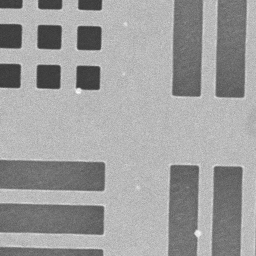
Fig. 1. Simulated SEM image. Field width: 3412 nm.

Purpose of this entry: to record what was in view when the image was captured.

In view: groups of lines, slits or small figures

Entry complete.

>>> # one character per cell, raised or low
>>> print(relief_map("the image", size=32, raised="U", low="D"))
DDDUUDDDUUDDDUUUUUUUUUDDDUUDDDDU
UUUUUUUUUUUUUUUUUUUUUUDDDUUDDDDU
UUUUUUUUUUUUUUUUUUUUUUDDDUUDDDDU
DDDUUDDDUUDDUUUUUUUUUUDDDUUDDDDU
DDDUUDDDUUDDDUUUUUUUUUDDDUUDDDDU
DDDUUDDDUUDDDUUUUUUUUUDDDUUDDDDU
UUUUUUUUUUUUUUUUUUUUUUDDDUUDDDDU
UUUUUUUUUUUUUUUUUUUUUUDDDUUDDDDU
DDDUUDDDUUDDUUUUUUUUUUDDDUUDDDDU
DDDUUDDDUUDDDUUUUUUUUDDDDUUDDDDU
DDDUUDDDUDDDDUUUUUUUUDDDDUUDDDDU
UUUUUUUUUUUUUUUUUUUUUDDDDUUDDDDU
UUUUUUUUUUUUUUUUUUUUUUUUUUUUUUUU
UUUUUUUUUUUUUUUUUUUUUUUUUUUUUUUU
UUUUUUUUUUUUUUUUUUUUUUUUUUUUUUUU
UUUUUUUUUUUUUUUUUUUUUUUUUUUUUUUU
UUUUUUUUUUUUUUUUUUUUUUUUUUUUUUUU
UUUUUUUUUUUUUUUUUUUUUUUUUUUUUUUU
UUUUUUUUUUUUUUUUUUUUUUUUUUUUUUUU
UUUUUUUUUUUUUUUUUUUUUUUUUUUUUUUU
DDDDDDDDDDDDDUUUUUUUUUUUUUUUUUUU
DDDDDDDDDDDDDUUUUUUUUDDDDUUDDDUU
DDDDDDDDDDDDDUUUUUUUUDDDDUUDDDUU
DDDDDDDDDDDDDUUUUUUUUDDDDUUDDDUU
UUUUUUUUUUUUUUUUUUUUUDDDDUUDDDUU
DDDDDDDDDUUUUUUUUUUUUDDDDUUDDDUU
DDDDDDDDDDDDDUUUUUUUUDDDDUUDDDUU
DDDDDDDDDDDDDUUUUUUUUDDDDUUDDDUU
DDDDDDDDDDDDDUUUUUUUUDDDDUDDDDUU
UUUUUUUUUUUUUUUUUUUUUDDDDUDDDDUU
UUUUUUUUUUUUUUUUUUUUUDDDDUDDDDUU
DDDDDDDDDDDDDUUUUUUUUDDDDUDDDDUU